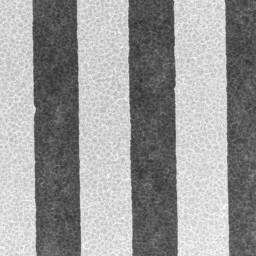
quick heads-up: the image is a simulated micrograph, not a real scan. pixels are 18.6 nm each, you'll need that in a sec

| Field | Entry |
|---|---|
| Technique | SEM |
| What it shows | one or a few lines or trenches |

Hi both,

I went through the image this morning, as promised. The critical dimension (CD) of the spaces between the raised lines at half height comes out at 845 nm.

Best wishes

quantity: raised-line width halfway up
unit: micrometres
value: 0.933